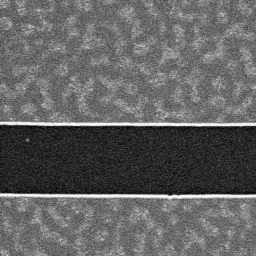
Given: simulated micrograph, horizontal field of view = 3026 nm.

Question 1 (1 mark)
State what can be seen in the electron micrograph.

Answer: one or a few lines or trenches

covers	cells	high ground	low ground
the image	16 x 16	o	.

oooooooooooooooo
oooooooooooooooo
oooooooooooooooo
oooooooooooooooo
oooooooooooooooo
oooooooooooooooo
oooooooooooooooo
oooooooooooooooo
................
................
................
................
oooooooooooooooo
oooooooooooooooo
oooooooooooooooo
oooooooooooooooo